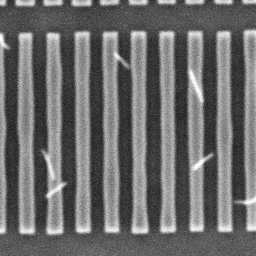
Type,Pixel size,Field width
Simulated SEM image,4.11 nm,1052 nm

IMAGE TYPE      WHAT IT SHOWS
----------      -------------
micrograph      groups of lines, slits or small figures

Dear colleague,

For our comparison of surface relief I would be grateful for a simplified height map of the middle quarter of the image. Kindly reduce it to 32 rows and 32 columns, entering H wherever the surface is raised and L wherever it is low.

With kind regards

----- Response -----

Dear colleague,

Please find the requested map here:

LLLHHHLLLLHHHLLLLHHHLLLLHHHLLLLH
LLLHHHLLLLHHHLLLLHHHLLLLHHHLLLLH
LLLHHHLLLLHHHLLLLHHHLLLLHHHLLLLH
LLLHHHLLLLHHHLLLLHHHLLLLHHHLLLLH
LLLHHHLLLLHHHLLLLHHHLLLLHHHLLLLH
LLLHHHLLLLHHHLLLLHHHLLLLHHHLLLLH
LLLHHHLLLLHHHLLLLHHHLLLLHHHLLLLH
LLLHHHLLLLHHHLLLLHHHLLLLHHHLLLLH
LLLHHHLLLLHHHLLLLHHHLLLLHHHLLLLH
LLLHHHLLLLHHHLLLLHHHLLLLLHHLLLLH
LLLHHHLLLLHHHLLLLHHHLLLLHHHLLLLH
LLLHHHLLLLHHHLLLLHHHLLLLHHHLLLLH
LLLHHHLLLLHHHLLLLHHHLLLLHHHLLLLH
LLLHHHLLLLHHHLLLLHHHLLLLHHHLLLLH
LLLHHHLLLLHHHLLLLHHHLLLLHHHLLLLH
LLLHHHLLLLHHHLLLLHHHLLLLHHHLLLLH
LLLHHHLLLLHHHLLLLHHHLLLLHHHLLLLH
LLLHHHLLLLHHHLLLLHHHLLLLLHHLLLLH
LLLHHHLLLLHHHLLLLHHHLLLLLHHLLLLH
LLLHHHLLLLHHHLLLLHHHLLLLLHHLLLLH
LLLHHHLLLLHHHLLLLHHHLLLLLHHLLLLH
LLLHHHLLLLHHHLLLLHHHLLLLLHHLLLLH
LLLHHHLLLLHHHLLLLHHHLLLLLHHLLLLH
LLLHHHLLLLHHHLLLLHHHLLLLLHHLLLLH
LLLHHHLLLLHHHLLLLHHHLLLLLHHLLLLH
LLLHHHLLLLHHHLLLLHHHLLLLLHHLLLLL
LLLHHHLLLLHHHLLLLHHHLLLLHHHLLLLL
LLLHHHLLLLHHHHLLLHHHLLLLHHHLLLLL
LLLHHHLLLLHHHHLLLHHHLLLLHHHLLLLL
LLLHHHLLLLHHHHLLLHHHLLLLLHHLLLLL
LLLHHHLLLLHHHHLLLHHHLLLLLHHLLLLL
LLLHHHLLLLHHHHLLLHHHLLLLLHHLLLLL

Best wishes